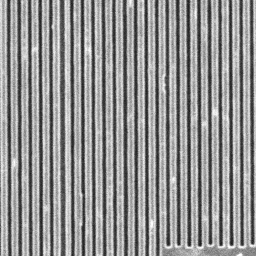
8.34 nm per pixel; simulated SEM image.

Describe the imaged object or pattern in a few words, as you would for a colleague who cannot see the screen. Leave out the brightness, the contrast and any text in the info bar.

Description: parallel lines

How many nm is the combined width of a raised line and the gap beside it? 88.2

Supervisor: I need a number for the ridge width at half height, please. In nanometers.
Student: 49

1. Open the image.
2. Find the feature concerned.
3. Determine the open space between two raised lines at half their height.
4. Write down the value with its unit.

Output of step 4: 40.7 nm